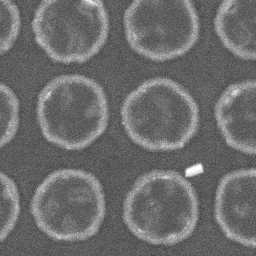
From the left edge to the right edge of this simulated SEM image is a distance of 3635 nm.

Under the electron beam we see raised bodies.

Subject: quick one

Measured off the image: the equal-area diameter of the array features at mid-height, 992 nm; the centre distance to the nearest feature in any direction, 1.28 micrometres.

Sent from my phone